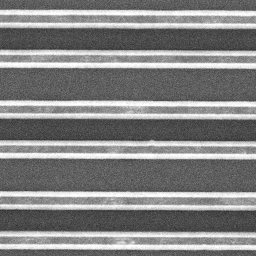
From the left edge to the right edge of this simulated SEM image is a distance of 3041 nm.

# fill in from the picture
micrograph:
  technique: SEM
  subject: parallel lines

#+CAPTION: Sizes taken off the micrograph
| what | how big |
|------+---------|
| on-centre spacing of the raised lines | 526 nm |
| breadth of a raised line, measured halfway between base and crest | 157 nanometres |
